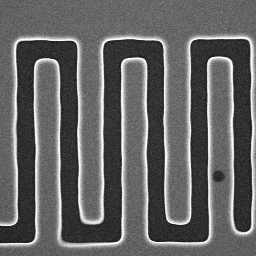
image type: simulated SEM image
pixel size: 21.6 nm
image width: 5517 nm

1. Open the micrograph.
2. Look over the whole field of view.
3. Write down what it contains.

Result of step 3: groups of lines, slits or small figures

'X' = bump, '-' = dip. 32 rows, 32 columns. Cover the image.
XXXXXXXXXXXXXXXXXXXXXXXXXXXXXXXX
XXXXXXXXXXXXXXXXXXXXXXXXXXXXXXXX
XXXXXXXXXXXXXXXXXXXXXXXXXXXXXXXX
XXXXXXXXXXXXXXXXXXXXXXXXXXXXXXXX
XXXXXXXXXXXXXXXXXXXXXXXXXXXXXXXX
XX-------XXXX-------XXXX-------X
XX--------XXX--------XXX-------X
XX---XX---XXX---XX---XXX--XXX--X
XX--XXX---XXX--XXX---XXX--XXX--X
XX--XXX---XXX--XXX---XXX--XXX---
XX--XXX---XXX--XXX---XXX--XXX--X
XX--XXX---XXX--XXX---XXX--XXX--X
XX--XXX---XXX--XXX---XXX--XXX--X
XX--XXXX--XXX--XXX---XXX--XXX--X
XX--XXXX--XXX--XXX---XXX--XXX---
XX--XXXX--XXX--XXX---XXX--XXX---
XX--XXX---XXX--XXX---XXX--XXX---
XX---XX---XXX--XXX---XXX--XXX---
XX---XX---XXX--XXX---XXX--XXX---
XX---XX---XXX--XXX---XXX--XXX--X
XX---XX---XXX--XXX---XXX--XXX---
XX---XX---XXX--XXX---XXX--XXX---
XX---XX---XXX--XXX---XXX--XXX---
XX---XXX--XXX--XXX---XXX--XXX---
XX---XXX--XXX--XXX---XXX--XXX---
XX---XXX--XXX--XXX---XXX--XXX---
XX---XXX--XXX--XXX---XXX--XXX---
XX---XXX--XXX--XXX---XXX--XXX---
-----XXX-------XXX--------XXX--X
----XXXX-------XXXX-------XXXXXX
XXXXXXXXX---XXXXXXXXXXXXXXXXXXXX
XXXXXXXXXXXXXXXXXXXXXXXXXXXXXXXX